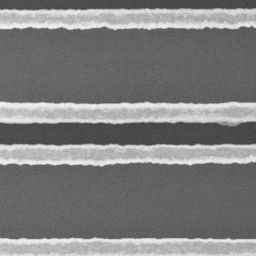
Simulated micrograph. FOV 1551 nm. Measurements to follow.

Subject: lines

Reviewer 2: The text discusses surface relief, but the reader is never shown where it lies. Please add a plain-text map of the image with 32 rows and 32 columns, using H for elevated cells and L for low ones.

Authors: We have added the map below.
LLLLLLLLLLLLLLLLLLLLLLLLLLLLLLLL
HHHHHHHHHHHHHHHHHHHHHHHHHHHHHHHH
HHHHHHHHHHHHHHHHHHHHHHHHHHHHHHHH
HLLLLLHLHHHLLLHLLLHLLLLLHLLLLHLL
LLLLLLLLLLLLLLLLLLLLLLLLLLLLLLLL
LLLLLLLLLLLLLLLLLLLLLLLLLLLLLLLL
LLLLLLLLLLLLLLLLLLLLLLLLLLLLLLLL
LLLLLLLLLLLLLLLLLLLLLLLLLLLLLLLL
LLLLLLLLLLLLLLLLLLLLLLLLLLLLLLLL
LLLLLLLLLLLLLLLLLLLLLLLLLLLLLLLL
LLLLLLLLLLLLLLLLLLLLLLLLLLLLLLLL
LLLLLLLLLLLLLLLLLLLLLLLLLLLLLLLL
LLLLLLLLLLLLLLLLLLLLLLLLLLLLLLLL
HHHHHHHHHHHHHHHHHHHHHHHHHHHHHHHH
HHHHHHHHHHHHHHHHHHHHHHHHHHHHHHHH
LLLLLLLLLLLLLLLLLLLLLLLLLLLLLLLL
LLLLLLLLLLLLLLLLLLLLLLLLLLLLLLLL
LLLLLLLLLLLLLLLLLLLLLLLLLLLLLLLL
HHHHHHHHHHHHHHHHHHHHHHHHHHHHHHHH
HHHHHHHHHHHHHHHHHHHHHHHHHHHHHHHH
LLLLLLLLLLHHHHLLLLLLLLLLLLLLLLLL
LLLLLLLLLLLLLLLLLLLLLLLLLLLLLLLL
LLLLLLLLLLLLLLLLLLLLLLLLLLLLLLLL
LLLLLLLLLLLLLLLLLLLLLLLLLLLLLLLL
LLLLLLLLLLLLLLLLLLLLLLLLLLLLLLLL
LLLLLLLLLLLLLLLLLLLLLLLLLLLLLLLL
LLLLLLLLLLLLLLLLLLLLLLLLLLLLLLLL
LLLLLLLLLLLLLLLLLLLLLLLLLLLLLLLL
LLLLLLLLLLLLLLLLLLLLLLLLLLLLLLLL
LLLLLLLLLLLLLLLLLLLLLLLLLLLLLLLL
HHHHHHHHHHHHHHHHHHHHHHHHHHHHHHHH
HHHHHHHHHHHHHHHHHHHHHHHHHHHHHHHH